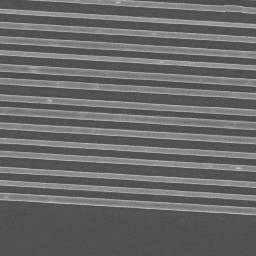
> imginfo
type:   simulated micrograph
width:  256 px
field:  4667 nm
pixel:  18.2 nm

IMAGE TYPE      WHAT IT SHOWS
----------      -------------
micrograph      parallel lines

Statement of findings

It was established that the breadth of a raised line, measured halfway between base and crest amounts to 0.109 microns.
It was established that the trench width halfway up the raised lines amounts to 141 nanometres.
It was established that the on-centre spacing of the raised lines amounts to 0.26 micrometres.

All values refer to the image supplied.